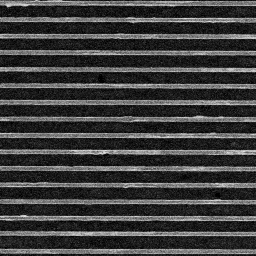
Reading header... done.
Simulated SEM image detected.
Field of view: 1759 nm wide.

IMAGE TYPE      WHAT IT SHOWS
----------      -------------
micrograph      parallel lines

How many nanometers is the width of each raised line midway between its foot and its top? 29.2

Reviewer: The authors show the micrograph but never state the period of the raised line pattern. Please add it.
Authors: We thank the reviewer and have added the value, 0.114 µm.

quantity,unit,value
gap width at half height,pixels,12